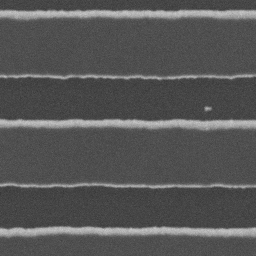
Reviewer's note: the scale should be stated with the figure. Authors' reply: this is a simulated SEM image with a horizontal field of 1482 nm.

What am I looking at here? lines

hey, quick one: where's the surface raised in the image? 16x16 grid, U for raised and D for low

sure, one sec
DDDDDDDDDDDDDDDD
UUUUUUUUUUUUUUUU
UUUUUUUUUUUUUUUU
UUUUUUUUUUUUUUUU
UUUUUUUUUUUUUUUU
DDDDDDDDDDDDDDDD
DDDDDDDDDDDDDDDD
DDDDDDDDDDDDDDDD
UUUUUUUUUUUUUUUU
UUUUUUUUUUUUUUUU
UUUUUUUUUUUUUUUU
UUUUUUUUUUUUUUUU
DDDDDDDDDDDDDDDD
DDDDDDDDDDDDDDDD
UUUUUUUUUUUUUUUU
UUUUUUUUUUUUUUUU